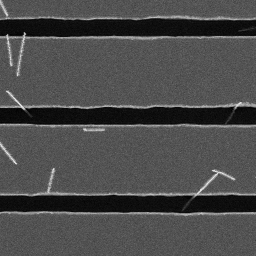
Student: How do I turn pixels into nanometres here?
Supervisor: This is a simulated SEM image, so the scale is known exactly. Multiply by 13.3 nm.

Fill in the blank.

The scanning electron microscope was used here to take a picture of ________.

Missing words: lines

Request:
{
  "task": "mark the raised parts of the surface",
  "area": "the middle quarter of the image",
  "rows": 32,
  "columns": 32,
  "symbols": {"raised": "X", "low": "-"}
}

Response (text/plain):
XXXXXXXXXXXXXXXXXXXXXXXXXXXXXXXX
XXXXXXXXXXXXXXXXXXXXXXXXXXXXXXXX
XXXXXXXXXXXXXXXXXXXXXXXXXXXXXXXX
XXXXXXXXXXXXXXXXXXXXXXXXXXXXXXXX
XXXXXXXXXXXXXXXXXXXXXXXXXXXXXXXX
XXXXXXXXXXXXXXXXXXXXXXXXXXXXXXXX
XXXXXXXXXXXXXXXXXXXXXXXXXXXXXXXX
XXXXXXXXXXXXXXXXXXXXXXXXXXXXXXXX
XXXXXXXXXXXXXXXXXXXXXXXXXXXXXXXX
XXXXXXXXXXXXXXXXXXXXXXXXXXXXXXXX
XXXXXXXXXXXXXXXXXXXXXXXXXXXXXXXX
--------------------------------
--------------------------------
--------------------------------
--------------------------------
XXXXXXXXXXXXXXXXXXXXXXXXXXXXXXXX
XXXXXXXXXXXXXXXXXXXXXXXXXXXXXXXX
XXXXXXXXXXXXXXXXXXXXXXXXXXXXXXXX
XXXXXXXXXXXXXXXXXXXXXXXXXXXXXXXX
XXXXXXXXXXXXXXXXXXXXXXXXXXXXXXXX
XXXXXXXXXXXXXXXXXXXXXXXXXXXXXXXX
XXXXXXXXXXXXXXXXXXXXXXXXXXXXXXXX
XXXXXXXXXXXXXXXXXXXXXXXXXXXXXXXX
XXXXXXXXXXXXXXXXXXXXXXXXXXXXXXXX
XXXXXXXXXXXXXXXXXXXXXXXXXXXXXXXX
XXXXXXXXXXXXXXXXXXXXXXXXXXXXXXXX
XXXXXXXXXXXXXXXXXXXXXXXXXXXXXXXX
XXXXXXXXXXXXXXXXXXXXXXXXXXXXXXXX
XXXXXXXXXXXXXXXXXXXXXXXXXXXXXXXX
XXXXXXXXXXXXXXXXXXXXXXXXXXXXXXXX
XXXXXXXXXXXXXXXXXXXXXXXXXXXXXXXX
XXXXXXXXXXXXXXXXXXXXXXXXXXXXXXXX